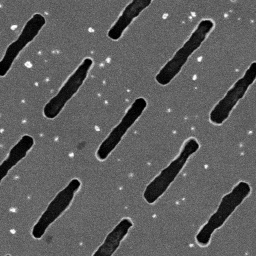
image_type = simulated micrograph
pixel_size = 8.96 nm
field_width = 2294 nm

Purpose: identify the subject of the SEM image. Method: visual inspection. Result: holes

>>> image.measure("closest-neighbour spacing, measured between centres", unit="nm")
595